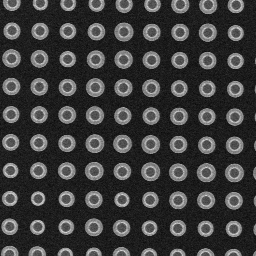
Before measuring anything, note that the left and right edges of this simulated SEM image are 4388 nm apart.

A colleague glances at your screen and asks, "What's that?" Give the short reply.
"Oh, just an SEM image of an array of small figures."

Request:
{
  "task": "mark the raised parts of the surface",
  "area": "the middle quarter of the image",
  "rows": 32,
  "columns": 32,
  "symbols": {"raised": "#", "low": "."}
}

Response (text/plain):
##....###....###....###....###..
................................
................................
................................
##....####...###....###.....##..
###...####...####...####...####.
###...####...####...####...####.
##....###....###....###....###..
................................
................................
................................
###...####...###....###....###..
###...####...####...####...####.
###...####...####...####...####.
##....###....###....###....###..
................................
................................
................................
##....####...###....###....###..
###...####..#####...####...####.
###..#####..#####..#####...####.
##....###....###....####...###..
................................
................................
................................
##....###....###....###....###..
###..#####...####..#####..#####.
###..#####...####..#####..#####.
##....###....###....###....###..
................................
................................
................................